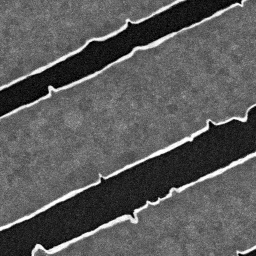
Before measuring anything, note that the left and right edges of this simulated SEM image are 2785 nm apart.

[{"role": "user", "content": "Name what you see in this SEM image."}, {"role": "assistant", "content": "one or a few lines or trenches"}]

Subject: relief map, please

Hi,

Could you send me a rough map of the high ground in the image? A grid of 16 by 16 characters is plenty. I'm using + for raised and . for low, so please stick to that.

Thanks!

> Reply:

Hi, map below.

++++++++++....++
++++++++....++++
++++++....++++++
++++....++++++++
++....++++++++++
....++++++++++++
..++++++++++++++
++++++++++++++..
++++++++++++....
++++++++++......
++++++++......++
++++++......++++
++++......++++++
++......++++++++
......++++++++++
....++++++++++++